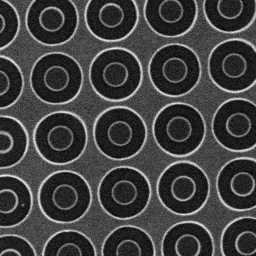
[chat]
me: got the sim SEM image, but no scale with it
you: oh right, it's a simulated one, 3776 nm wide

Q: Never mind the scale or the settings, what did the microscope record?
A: an array of small figures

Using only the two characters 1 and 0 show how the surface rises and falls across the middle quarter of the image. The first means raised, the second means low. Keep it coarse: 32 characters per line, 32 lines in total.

00001110000111100001100001111110
00001110001111110001100001111110
10001100001111110001100001111100
10000100001111110001110000111100
10001110000111100001110000010000
00001110000000000001111000000000
00001111000000000011111100000000
00011111100000000111111110000011
00111111110000001111111111111111
01111111111111111111111111111111
11111111111111111111111111000000
11111111111000000111111100000000
00111111100000000011111000000000
00001111000000000001111000001100
00000111000000100000111000111110
00000111000011110000110000111111
10000110000111111000010000111111
11000010000111111000010000111111
11000011000111111000111000011110
11000011000011110000111000000000
10000111000000000000111100000000
00000111100000000001111110000000
00001111110000000011111111100001
00011111111100001111111111111111
00111111111111111111111111111001
11111111111111111111111111000000
11111111111100000011111110000000
00011111111000000000111110000000
00000111110000000000111100001110
00000011100000110000011100011111
10000011100001111100011000011111
11100001100011111100001000011111